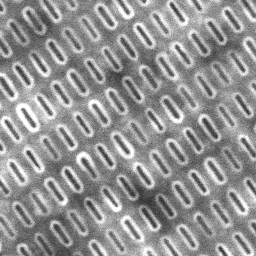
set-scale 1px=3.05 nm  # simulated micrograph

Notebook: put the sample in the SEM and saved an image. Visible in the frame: a regular array of holes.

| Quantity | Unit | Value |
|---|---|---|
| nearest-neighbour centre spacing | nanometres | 61.5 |